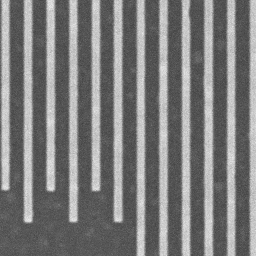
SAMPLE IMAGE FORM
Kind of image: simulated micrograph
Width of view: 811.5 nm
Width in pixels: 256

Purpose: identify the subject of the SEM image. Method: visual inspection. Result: parallel lines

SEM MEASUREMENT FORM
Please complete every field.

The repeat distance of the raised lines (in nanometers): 71.5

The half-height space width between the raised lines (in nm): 50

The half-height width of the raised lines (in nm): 22.2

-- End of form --